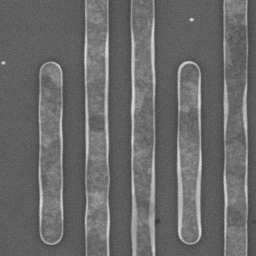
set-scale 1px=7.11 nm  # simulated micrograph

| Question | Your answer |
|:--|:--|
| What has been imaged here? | groups of lines, slits or small figures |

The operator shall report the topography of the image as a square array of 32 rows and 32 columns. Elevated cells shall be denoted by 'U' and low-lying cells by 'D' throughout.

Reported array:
DDDDDDDDDDDUUDDDDUUDDDDDDDDDUUUD
DDDDDDDDDDDUUDDDUUUDDDDDDDDDUUUD
DDDDDDDDDDDUUDDDUUUDDDDDDDDDUUUD
DDDDDDDDDDDUUUDDUUUDDDDDDDDDUUUD
DDDDDDDDDDDUUDDDDUUDDDDDDDDDUUUD
DDDDDDDDDDDUUDDDDUUDDDDDDDDDUUUD
DDDDDDDDDDDUUDDDDUUDDDDDDDDDUUUD
DDDDDDDDDDDUUDDDDUUDDDDDDDDDUUUD
DDDDDUUUDDDUUDDDDUUDDDDUUDDDUUUD
DDDDDUUUDDDUUDDDDUUDDDUUUDDDUUUD
DDDDDUUUDDDUUDDDDUUDDDUUUDDDUUUD
DDDDDUUUDDDUUDDDDUUDDDUUUDDDUUUD
DDDDDUUUDDDUUDDDDUUDDDUUUDDDUUUD
DDDDDUUUDDDUUDDDDUUDDDUUUDDDUUUD
DDDDDUUUDDDUUDDDDUUDDDUUUDDDUUUD
DDDDDUUUDDDUUDDDDUUDDDUUUDDDUUUD
DDDDDUUUDDDUUDDDDUUDDDUUUDDDUUUD
DDDDDUUUDDDUUDDDDUUDDDUUUDDDUUUD
DDDDDUUUDDDUUDDDDUUDDDUUUDDDUUUD
DDDDDUUUDDDUUDDDDUUDDDUUUDDDUUUD
DDDDDUUUDDDUUUDDDUUDDDUUUDDDUUUD
DDDDDUUUDDDUUUDDDUUDDDUUUDDDUUUD
DDDDDUUUDDDUUUDDDUUDDDDUUDDDUUUD
DDDDDUUUDDDUUUDDDUUDDDDUUDDDUUUD
DDDDDUUUDDDUUDDDDUUDDDDUUDDDUUUD
DDDDDUUUDDDUUDDDDUUDDDDUUDDDUUUD
DDDDDUUUDDDUUUDDDUUDDDDUUDDDUUUD
DDDDDUUUDDDUUUDDDUUDDDDUUDDDUUUD
DDDDDUUUDDDUUUDDDUUDDDDUUDDDUUUD
DDDDDUUUDDDUUDDDDUUDDDDUUDDDUUUD
DDDDDDUDDDDUUUDDDUUDDDDDDDDDUUUD
DDDDDDDDDDDUUUDDDUUDDDDDDDDDUUUD